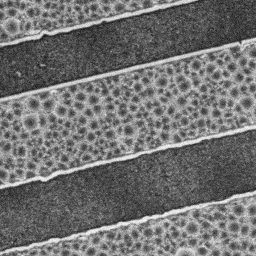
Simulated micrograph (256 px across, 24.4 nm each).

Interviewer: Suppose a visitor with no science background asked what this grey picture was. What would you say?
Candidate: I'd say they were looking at one or a few lines or trenches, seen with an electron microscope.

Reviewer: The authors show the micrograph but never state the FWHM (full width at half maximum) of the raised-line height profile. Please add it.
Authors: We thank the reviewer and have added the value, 2050 nanometres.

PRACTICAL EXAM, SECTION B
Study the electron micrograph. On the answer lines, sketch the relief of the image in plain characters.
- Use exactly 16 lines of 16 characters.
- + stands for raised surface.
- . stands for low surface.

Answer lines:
++++++++++......
++++++..........
+...............
............++++
........++++++++
...+++++++++++++
++++++++++++++++
++++++++++++++++
+++++++++++++...
+++++++++.......
+++++...........
+...............
..............++
..........++++++
......++++++++++
..++++++++++++++